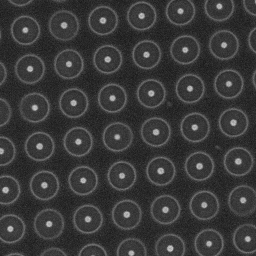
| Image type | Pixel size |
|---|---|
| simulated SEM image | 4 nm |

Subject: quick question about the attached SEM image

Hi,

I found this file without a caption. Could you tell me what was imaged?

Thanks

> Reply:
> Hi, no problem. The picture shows an array of small figures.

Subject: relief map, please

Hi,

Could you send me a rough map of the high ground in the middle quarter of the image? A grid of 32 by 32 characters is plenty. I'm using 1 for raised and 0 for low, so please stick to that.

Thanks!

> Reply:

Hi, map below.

01001111000000111110001111111111
00001111100001111111111111111111
00001111111111111111111111111111
10111111111111111111111111111100
11111111111111111111000111111000
11111111111001111110000011110000
10011111100000011110000001110001
00000111100000011110010001110000
00000111100010011110000001111000
00100011100000011110000011111110
00000011100000011111100111111111
00000111111000111111111111111111
00001111111111111111111111111111
11111111111111111111111111111100
11111111111111111111100001111100
11111111111000011111000000111000
11000111110000001110000000111000
10000011110000000110000000111100
00000001110000000111000000111110
00010001110000000111100001111111
00000001111000001111111111111111
10000011111100111111111111111111
11000111111111111111111111111111
11111111111111111111111001111110
11111111111111111111110000011110
11111111111100000111100000011110
11100001111100000011100010001110
11000000111000100011100000011110
10000000111000000011100000011111
10000000111100000111110000111111
11000000111100000111111111111111
11000001111111111111111111111111